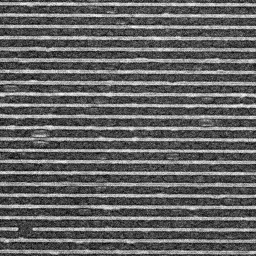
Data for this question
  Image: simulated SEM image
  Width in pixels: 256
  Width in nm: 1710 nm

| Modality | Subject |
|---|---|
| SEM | parallel lines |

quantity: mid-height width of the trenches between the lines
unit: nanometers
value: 55.9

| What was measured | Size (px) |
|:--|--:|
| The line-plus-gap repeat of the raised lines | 11.3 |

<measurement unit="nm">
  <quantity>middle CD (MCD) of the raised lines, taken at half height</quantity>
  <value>19.2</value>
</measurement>